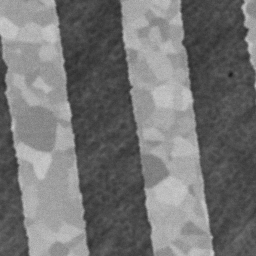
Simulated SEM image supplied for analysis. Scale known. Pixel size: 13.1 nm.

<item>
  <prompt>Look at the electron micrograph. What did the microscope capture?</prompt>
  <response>one or a few lines or trenches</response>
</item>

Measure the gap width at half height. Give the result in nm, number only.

848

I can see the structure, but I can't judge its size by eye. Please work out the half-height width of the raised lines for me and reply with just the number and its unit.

0.761 micrometres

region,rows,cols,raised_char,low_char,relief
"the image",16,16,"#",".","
###.....###....#
####....###....#
####....###....#
####....####....
####....####....
####....####....
.###....####....
.###....####....
.####....###....
.####....###....
.####....####...
.####....####...
.####....####...
..###....####...
..###....####...
..###.....###...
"